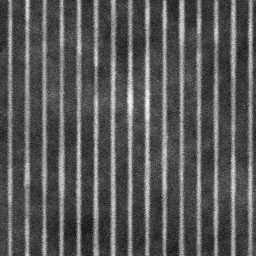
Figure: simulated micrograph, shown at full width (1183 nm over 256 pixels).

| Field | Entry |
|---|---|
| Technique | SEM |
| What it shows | parallel lines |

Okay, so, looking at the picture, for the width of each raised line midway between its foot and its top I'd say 11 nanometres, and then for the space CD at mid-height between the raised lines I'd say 69.4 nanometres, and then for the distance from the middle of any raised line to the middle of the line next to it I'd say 79.4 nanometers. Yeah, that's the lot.